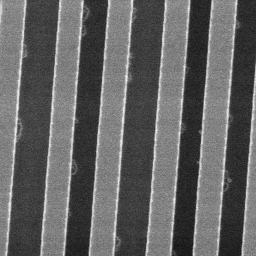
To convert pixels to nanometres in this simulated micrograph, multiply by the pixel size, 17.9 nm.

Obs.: lines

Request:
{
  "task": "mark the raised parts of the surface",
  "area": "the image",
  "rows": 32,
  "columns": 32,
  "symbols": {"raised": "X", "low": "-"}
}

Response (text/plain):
XXX----XXX----XXX----XXX--XXXX--
XXX----XXX---XXXX----XXX--XXXX--
XXX----XXX---XXX-----XXX--XXX---
XXX----XXX---XXX----XXXX--XXX---
XXX----XXX---XXX----XXX---XXX---
XXX----XXX---XXX----XXX---XXX---
XXX----XXX---XXX----XXX---XXX---
XXX----XXX---XXX----XXX---XXX---
XXX----XXX---XXX----XXX---XXX---
XXX----XXX---XXX----XXX---XXX---
XX-----XXX---XXX----XXX---XXX---
XX-----XXX---XXX----XXX---XXX---
XX-----XX----XXX----XXX---XXX---
XX-----XX----XXX----XXX--XXXX---
XX----XXX---XXX-----XXX--XXX----
XX----XXX---XXX-----XXX--XXX---X
XX----XXX---XXX----XXXX--XXX---X
XX----XXX---XXX----XXX---XXX---X
XX----XXX---XXX----XXX---XXX---X
XX----XXX---XXX----XXX---XXX---X
XX----XXX---XXX----XXX---XXX---X
XX----XXX---XXX----XXX---XXX---X
XX----XXX---XXX----XXX---XXX---X
X-----XXX---XXX----XXX---XXX---X
X-----XXX---XXX----XXX---XXX---X
X-----XXX---XXX----XXX---XXX---X
X----XXXX---XXX----XXX--XXXX---X
X----XXX---XXXX----XXX--XXXX---X
X----XXX---XXX-----XXX--XXXX--XX
X----XXX---XXX----XXXX--XXX---XX
X----XXX---XXX----XXX---XXX---XX
X----XXX---XXX----XXX---XXX---XX